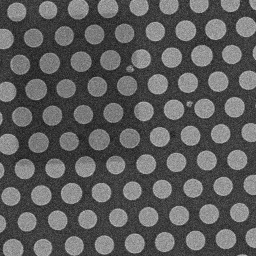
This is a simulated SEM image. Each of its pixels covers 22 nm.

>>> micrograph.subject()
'an array of small figures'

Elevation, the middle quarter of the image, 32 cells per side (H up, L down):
LLHHHHHLLLHHHHLLLLHHHLLLLLHHLLLL
LLLHHHLLLLLLLLLLLLLLLLLLLLLLLLLL
LLLLLLLLLLLLLLLLLLLLLLLLLLLLLLHH
LLLLLLLHHLLLLLLHHLLLLLHHHLLLLHHH
HHLLLLHHHHLLLLHHHHLLLHHHHHLLLHHH
HHHLLLHHHHHLLHHHHHLLLHHHHHLLLHHH
HHHLLLHHHHHLLLHHHHLLLHHHHLLLLHHH
HHLLLLLHHHLLLLLHHLLLLLLLLLLLLLLL
LLLLLLLLLLLLLLLLLLLLLLLLLLLLLLLL
LLLLLLLLLLLLLLLLLLLLLLLLLLHHHLLL
LLLLHLLLLLLHHHLLLLHHHHLLLHHHHHLL
LLLHHHHLLLHHHHHLLLHHHHLLLHHHHHLL
LLLHHHHLLLHHHHHLLLHHHHLLLHHHHHLL
LLLHHHHLLLHHHHLLLLHHHHLLLLHHHLLL
LLLLHHLLLLLLLLLLLLLLLLLLLLLLLLLL
LLLLLLLLLLLLLLLLLLLLLLLLLLLLLLLL
LLLLLLLLHHLLLLLHHHLLLLHHHHLLLLHH
HHHLLLLHHHHLLLHHHHHLLLHHHHLLLHHH
HHHLLLHHHHHLLLHHHHHLLLHHHHLLLHHH
HHHHLLHHHHHLLLHHHHHLLLHHHHLLLLHH
HHHLLLLHHHHLLLLHHHLLLLLHHLLLLLLL
LLLLLLLLLLLLLLLLLLLLLLLLLLLLLLLL
LLLLLLLLLLLLLLLLLLLLLLLLLLLHHLLL
LLLLHHHLLLLHHHLLLLLHHHLLLLHHHHLL
LLLHHHHHLLLHHHHLLLHHHHHLLLHHHHLL
LLLHHHHHLLLHHHHLLLHHHHHLLLHHHHLL
LLLHHHHHLLLHHHHLLLLHHHLLLLLHHLLL
LLLLHHHLLLLLLLLLLLLLLLLLLLLLLLLL
LLLLLLLLLLLLLLLLLLLLLLLLLLLLLLLL
LLLLLLLLLLLLLLLLLLLLLLLHHHLLLLLH
HHHHLLLLHHHLLLLHHHHLLLHHHHHLLLHH
HHHHLLLHHHHHLLLHHHHLLLHHHHHLLLHH